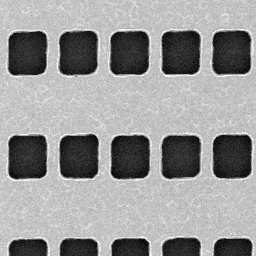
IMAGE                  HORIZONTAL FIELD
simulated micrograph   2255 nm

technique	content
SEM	a regular array of holes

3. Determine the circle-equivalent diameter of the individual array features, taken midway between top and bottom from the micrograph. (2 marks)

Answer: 411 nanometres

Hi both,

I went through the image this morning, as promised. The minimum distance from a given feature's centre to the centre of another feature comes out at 449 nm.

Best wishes